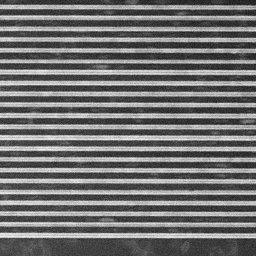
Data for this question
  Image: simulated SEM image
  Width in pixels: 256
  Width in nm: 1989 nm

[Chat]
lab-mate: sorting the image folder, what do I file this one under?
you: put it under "parallel lines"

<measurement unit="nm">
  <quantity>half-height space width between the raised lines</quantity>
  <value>57.3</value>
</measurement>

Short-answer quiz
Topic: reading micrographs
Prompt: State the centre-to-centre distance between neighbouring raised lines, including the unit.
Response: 10.9 pixels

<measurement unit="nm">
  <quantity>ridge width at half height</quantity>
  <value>25.2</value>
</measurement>